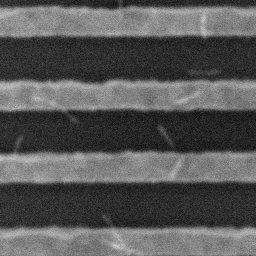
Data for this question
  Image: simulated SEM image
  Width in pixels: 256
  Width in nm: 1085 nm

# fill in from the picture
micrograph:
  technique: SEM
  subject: lines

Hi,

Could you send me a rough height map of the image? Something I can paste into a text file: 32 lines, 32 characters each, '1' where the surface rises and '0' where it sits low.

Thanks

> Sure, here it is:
00000000000000000000000000000000
11111111111111111111111111111111
11111111111111111111111111111111
11111111111111111111111111111111
11110000000001000001100001000000
00000000000000000000000000000000
00000000000000000000000000000000
00000000000000000000000000000000
00000000000000000000000000000000
00000000000000000000000000000000
01111111110001111111111111111111
11111111111111111111111111111111
11111111111111111111111111111111
11111111111111111111111111111111
00000000000000000000000000000000
00000000000000000000000000000000
00000000000000000000000000000000
00000000000000000000000000000000
00000000000000000000000000000000
01000000111111111111111111111111
11111111111111111111111111111111
11111111111111111111111111111111
11111111111111111111111111111111
00000000000000000000000000000000
00000000000000000000000000000000
00000000000000000000000000000000
00000000000000000000000000000000
00000000000000000000000000000000
00000000000000000000000000000000
11111111111111111111111111111111
11111111111111111111111111111111
11111111111111111111111111111111